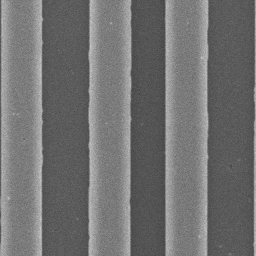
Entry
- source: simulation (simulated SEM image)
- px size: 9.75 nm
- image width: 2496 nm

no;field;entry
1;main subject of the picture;lines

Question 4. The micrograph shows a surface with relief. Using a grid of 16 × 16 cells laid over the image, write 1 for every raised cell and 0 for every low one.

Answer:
1110001100111000
1110001100111000
1110001100111000
1110001100111000
1110001100111000
1110001100111000
1110001100111000
1110001100111000
1110001100111000
1110001100111000
1110001100111000
1110001100111000
1110001100111000
1110001100111000
1110001100111000
1110001100111000